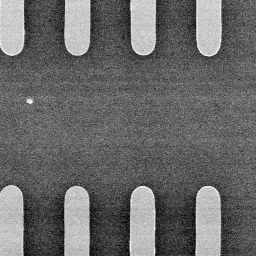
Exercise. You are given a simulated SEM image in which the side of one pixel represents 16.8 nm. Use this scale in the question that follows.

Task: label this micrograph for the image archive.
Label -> groups of lines, slits or small figures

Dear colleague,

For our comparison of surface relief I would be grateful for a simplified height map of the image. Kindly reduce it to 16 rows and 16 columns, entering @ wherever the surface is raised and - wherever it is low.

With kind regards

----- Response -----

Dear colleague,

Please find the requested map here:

@---@@--@@--@@--
@---@@--@@--@@--
@---@@--@@--@@--
----------------
----------------
----------------
----------------
----------------
----------------
----------------
----------------
----------------
@---@@--@@--@@--
@---@@--@@--@@--
@---@@--@@--@@--
@---@@--@@--@@--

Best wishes